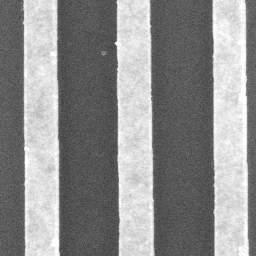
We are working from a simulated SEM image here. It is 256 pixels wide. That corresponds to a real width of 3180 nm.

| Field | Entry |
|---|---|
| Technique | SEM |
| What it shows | lines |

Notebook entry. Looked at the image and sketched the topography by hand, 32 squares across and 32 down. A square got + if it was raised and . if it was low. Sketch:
...++++........++++........++++.
...++++........++++........++++.
...++++........++++........++++.
...++++........++++........++++.
...++++........++++........++++.
...++++........++++........++++.
...++++........++++........++++.
...++++........++++........++++.
...++++........++++........++++.
...++++........++++........++++.
...++++........++++........++++.
...++++........++++........++++.
...++++........++++........++++.
...++++........++++........++++.
...++++........++++........++++.
...++++........++++........++++.
...++++........++++........++++.
...++++........++++........++++.
...++++........++++........++++.
...++++........++++........++++.
...++++........++++........++++.
...++++........++++........++++.
...++++........++++........++++.
...++++........++++........++++.
...++++........++++........++++.
...++++........++++........++++.
...++++........++++........++++.
...++++........++++........++++.
...++++........++++........++++.
...++++........++++........++++.
...++++........++++........++++.
...++++........++++........++++.